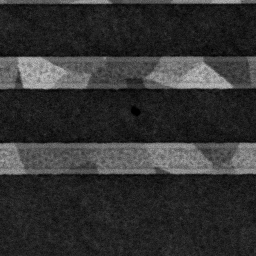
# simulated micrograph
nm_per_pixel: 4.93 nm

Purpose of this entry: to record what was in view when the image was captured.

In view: one or a few lines or trenches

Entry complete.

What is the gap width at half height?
288 nanometres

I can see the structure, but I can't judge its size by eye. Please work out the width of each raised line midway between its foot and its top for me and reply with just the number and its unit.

132 nm